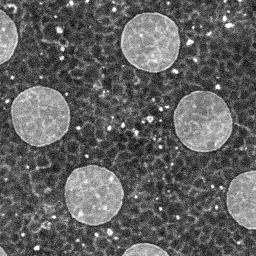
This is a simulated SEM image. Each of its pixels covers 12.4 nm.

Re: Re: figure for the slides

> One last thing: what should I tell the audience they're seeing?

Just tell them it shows raised bodies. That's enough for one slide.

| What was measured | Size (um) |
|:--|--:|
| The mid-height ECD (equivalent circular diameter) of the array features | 0.728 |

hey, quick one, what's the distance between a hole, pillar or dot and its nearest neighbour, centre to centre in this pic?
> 1180 nanometers